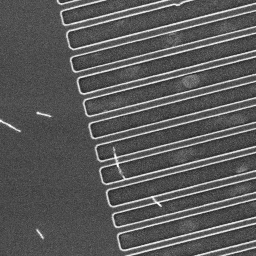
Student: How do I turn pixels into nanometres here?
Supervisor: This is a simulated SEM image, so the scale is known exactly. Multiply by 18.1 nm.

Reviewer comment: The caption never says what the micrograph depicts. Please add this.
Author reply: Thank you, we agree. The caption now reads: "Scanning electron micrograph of parallel lines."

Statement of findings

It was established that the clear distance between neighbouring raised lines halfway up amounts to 294 nm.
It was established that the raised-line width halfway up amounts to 0.121 µm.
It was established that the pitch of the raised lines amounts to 419 nm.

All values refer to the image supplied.